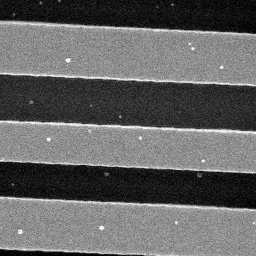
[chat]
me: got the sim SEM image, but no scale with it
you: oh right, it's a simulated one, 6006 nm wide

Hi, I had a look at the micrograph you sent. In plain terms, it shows lines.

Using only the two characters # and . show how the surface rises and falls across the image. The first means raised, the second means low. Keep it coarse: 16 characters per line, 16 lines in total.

................
##..............
################
################
################
................
................
................
################
################
..........######
................
###.............
################
################
################